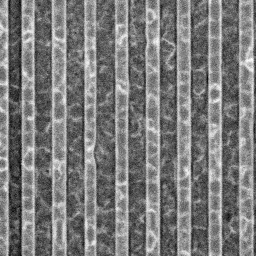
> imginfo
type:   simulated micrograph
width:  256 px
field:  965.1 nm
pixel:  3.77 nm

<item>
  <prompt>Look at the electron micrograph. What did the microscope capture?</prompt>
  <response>parallel lines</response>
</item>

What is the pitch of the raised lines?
0.118 microns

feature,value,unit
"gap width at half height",67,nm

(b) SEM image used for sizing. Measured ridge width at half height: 13 px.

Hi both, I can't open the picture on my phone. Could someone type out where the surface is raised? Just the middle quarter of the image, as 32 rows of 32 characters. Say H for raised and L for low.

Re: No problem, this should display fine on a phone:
LLLLLHHHLLLLLHHHLLLLLHHHLLLLHHHH
LLLLLHHHLLLLLHHHLLLLLHHHLLLLHHHH
LLLLLHHHLLLLLHHHLLLLLHHHLLLLHHHH
LLLLLHHHLLLLLHHHLLLLLHHHLLLLHHHH
LLLLLHHHLLLLLHHHLLLLLHHHLLLLHHHH
LLLLLHHHLLLLLHHHLLLLLHHHLLLLHHHL
LLLLLHHHLLLLLHHHLLLLLHHHLLLLHHHL
LLLLLHHHLLLLLHHHLLLLLHHHLLLLHHHL
LLLLLHHHLLLLLHHHLLLLLHHHLLLLHHHH
LLLLLHHHLLLLLHHHLLLLLHHHLLLLHHHH
LLLLLHHHLLLLLHHHLLLLLHHHLLLLLHHL
LLLLLHHHLLLLLHHHLLLLLHHHLLLLLHHL
LLLLLHHHLLLLLHHHLLLLLHHHLLLLLHHL
LLLLLHHHLLLLLHHHLLLLLHHHLLLLLHHH
LLLLLHHHLLLLLHHHLLLLLHHHLLLLHHHH
LLLLLHHHLLLLLHHHLLLLLHHHLLLLHHHH
LLLLLHHHLLLLLHHHLLLLLHHHLLLLHHHH
LLLLLHHHLLLLLHHHLLLLLHHHLLLLHHHH
LLLLLHHHLLLLLHHHLLLLLHHHLLLLHHHH
LLLLLHHHLLLLLHHHLLLLLHHHLLLLHHHH
LLLLLHHHLLLLLHHHLLLLLHHHLLLLHHHH
LLLLLHHLLLLLLHHHLLLLLHHHLLLLHHHH
LLLLLHHLLLLLLHHHLLLLLHHHLLLLLHHH
LLLLLHHLLLLLLHHHLLLLLHHHLLLLLHHH
LLLLLHHHLLLLLHHHLLLLLHHHLLLLLHHH
LLLLLHHHLLLLLHHHLLLLLHHHLLLLLHHH
LLLLLHHHLLLLLHHHLLLLLHHHLLLLLHHH
LLLLLHHHLLLLLHHHLLLLLHHHLLLLHHHH
LLLLLHHHLLLLLHHHLLLLLHHHLLLLHHHH
LLLLLHHHLLLLLHHHLLLLLHHHLLLLHHHH
LLLLLHHHLLLLLHHHLLLLLHHHLLLLHHHH
LLLLLHHHLLLLLHHHLLLLLHHHLLLLLHHH